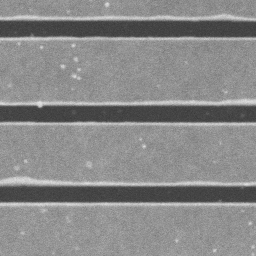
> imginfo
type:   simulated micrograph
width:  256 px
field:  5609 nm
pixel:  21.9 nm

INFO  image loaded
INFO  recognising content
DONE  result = lines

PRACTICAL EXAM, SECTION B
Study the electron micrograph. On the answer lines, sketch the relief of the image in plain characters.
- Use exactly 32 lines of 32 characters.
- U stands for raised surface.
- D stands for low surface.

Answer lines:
UUUUUUUUUUUUUUUUUUUUUUUUUUUUUUUU
UUUUUUUUUUUUUUUUUUUUUUUUUUUUUUUU
UUDDDUUUUUUUDDDUUUUUDUUUUUUDUUUU
DDDDDDDDDDDDDDDDDDDDDDDDDDDDDDDD
DDDDDDDDDDDDDDDDDDDDDDDDDDDDDDDD
UUUUUUUUUUUUUUUUUUUUUUUUUUUUUUUU
UUUUUUUUUUUUUUUUUUUUUUUUUUUUUUUU
UUUUUUUUUUUUUUUUUUUUUUUUUUUUUUUU
UUUUUUUUUUUUUUUUUUUUUUUUUUUUUUUU
UUUUUUUUUUUUUUUUUUUUUUUUUUUUUUUU
UUUUUUUUUUUUUUUUUUUUUUUUUUUUUUUU
UUUUUUUUUUUUUUUUUUUUUUUUUUUUUUUU
UUUUUUUUUUUUUUUUUUUUUUUUUUUUUUUU
DDDDDDDDDDDDDDDDDDDDDDDDDDDDDDDD
DDDDDDDDDDDDDDDDDDDDDDDDDDDDDDDD
UUUUUUUUUUUUUUUUUUUUUUUUUUUUUUUU
UUUUUUUUUUUUUUUUUUUUUUUUUUUUUUUU
UUUUUUUUUUUUUUUUUUUUUUUUUUUUUUUU
UUUUUUUUUUUUUUUUUUUUUUUUUUUUUUUU
UUUUUUUUUUUUUUUUUUUUUUUUUUUUUUUU
UUUUUUUUUUUUUUUUUUUUUUUUUUUUUUUU
UUUUUUUUUUUUUUUUUUUUUUUUUUUUUUUU
UUUUUUUUUUUUUUUUUUUUUUUUUUUUUUUU
DDDDDDDDDDDDDDDDDDDDDDDDDDDDDDDD
DDDDDDDDDDDDDDDDDDDDDDDDDDDDDDDD
UUUUUUUUUUUUUUUUUUUUUUUUUUUUUUUU
UUUUUUUUUUUUUUUUUUUUUUUUUUUUUUUU
UUUUUUUUUUUUUUUUUUUUUUUUUUUUUUUU
UUUUUUUUUUUUUUUUUUUUUUUUUUUUUUUU
UUUUUUUUUUUUUUUUUUUUUUUUUUUUUUUU
UUUUUUUUUUUUUUUUUUUUUUUUUUUUUUUU
UUUUUUUUUUUUUUUUUUUUUUUUUUUUUUUU